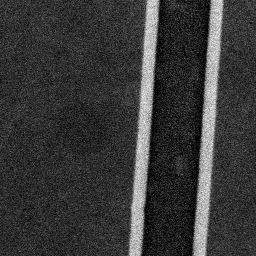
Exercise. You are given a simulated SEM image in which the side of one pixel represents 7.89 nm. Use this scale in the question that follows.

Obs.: one or a few lines or trenches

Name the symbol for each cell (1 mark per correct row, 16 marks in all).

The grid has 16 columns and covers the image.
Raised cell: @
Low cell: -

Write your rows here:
@@@@@@@@@-----@@
@@@@@@@@@-----@@
@@@@@@@@@----@@@
@@@@@@@@@----@@@
@@@@@@@@@----@@@
@@@@@@@@@----@@@
@@@@@@@@@----@@@
@@@@@@@@@----@@@
@@@@@@@@@----@@@
@@@@@@@@@----@@@
@@@@@@@@@----@@@
@@@@@@@@@----@@@
@@@@@@@@@----@@@
@@@@@@@@@----@@@
@@@@@@@@-----@@@
@@@@@@@@-----@@@